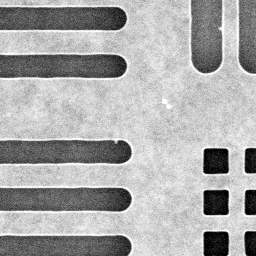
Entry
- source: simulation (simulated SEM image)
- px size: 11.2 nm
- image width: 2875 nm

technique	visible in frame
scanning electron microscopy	groups of lines, slits or small figures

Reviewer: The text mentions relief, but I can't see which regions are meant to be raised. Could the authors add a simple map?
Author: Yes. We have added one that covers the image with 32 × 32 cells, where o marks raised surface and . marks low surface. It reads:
oooooooooooooooooooooooo....oo..
................oooooooo....oo..
................oooooooo....oo..
...............ooooooooo....oo..
oooooooooooooooooooooooo....oo..
oooooooooooooooooooooooo....oo..
oooooooooooooooooooooooo....oo..
................oooooooo....oo..
................oooooooo...ooo..
...............ooooooooooooooooo
oooooooooooooooooooooooooooooooo
oooooooooooooooooooooooooooooooo
oooooooooooooooooooooooooooooooo
oooooooooooooooooooooooooooooooo
oooooooooooooooooooooooooooooooo
oooooooooooooooooooooooooooooooo
oooooooooooooooooooooooooooooooo
...............ooooooooooooooooo
................oooooooooo..ooo.
................ooooooooo....o..
........oooooo.oooooooooo....o..
oooooooooooooooooooooooooo..ooo.
oooooooooooooooooooooooooooooooo
...............ooooooooooooooooo
................ooooooooo....oo.
................ooooooooo....o..
oooooooooooooo.oooooooooo....oo.
oooooooooooooooooooooooooooooooo
oooooooooooooooooooooooooooooooo
................ooooooooo....oo.
................ooooooooo....o..
................ooooooooo....oo.